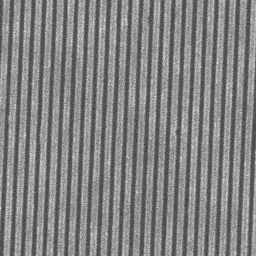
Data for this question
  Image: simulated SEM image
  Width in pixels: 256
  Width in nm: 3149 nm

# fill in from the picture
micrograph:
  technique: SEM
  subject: parallel lines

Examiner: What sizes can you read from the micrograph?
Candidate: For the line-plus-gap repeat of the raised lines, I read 132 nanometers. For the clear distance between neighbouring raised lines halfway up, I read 58.4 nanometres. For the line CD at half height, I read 69.1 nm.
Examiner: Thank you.